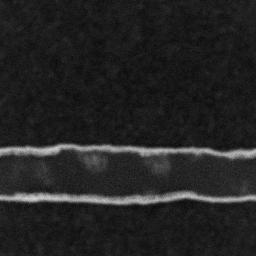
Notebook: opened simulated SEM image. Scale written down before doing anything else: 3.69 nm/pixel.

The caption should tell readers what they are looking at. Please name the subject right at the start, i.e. one or a few lines or trenches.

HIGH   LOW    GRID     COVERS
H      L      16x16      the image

LLLLLLLLLLLLLLLL
LLLLLLLLLLLLLLLL
LLLLLLLLLLLLLLLL
LLLLLLLLLLLLLLLL
LLLLLLLLLLLLLLLL
LLLLLLLLLLLLLLLL
LLLLLLLLLLLLLLLL
LLLLLLLLLLLLLLLL
LLLLLLLLLLLLLLLL
HHHHHHHHHHHHHLLL
HHHHHHHHHHHHHHHH
HHHHHHHHHHHHHHHH
LLLLLLHHHHLLLHHL
LLLLLLLLLLLLLLLL
LLLLLLLLLLLLLLLL
LLLLLLLLLLLLLLLL